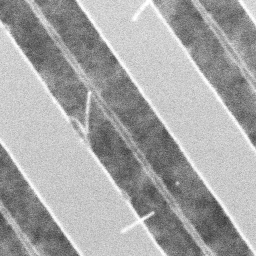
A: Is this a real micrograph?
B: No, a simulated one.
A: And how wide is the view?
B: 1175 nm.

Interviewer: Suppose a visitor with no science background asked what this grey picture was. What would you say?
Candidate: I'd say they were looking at lines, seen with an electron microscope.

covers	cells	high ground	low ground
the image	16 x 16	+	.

.....+++++.....+
......++++......
+......++++.....
++.....+++++....
++......+++++...
+++......++++...
++++.....+++++..
+++++.....+++++.
+++++......++++.
++++++.....+++++
.+++++......++++
..+++++......+++
...+++++......++
...++++++.....++
....+++++......+
.....+++++......